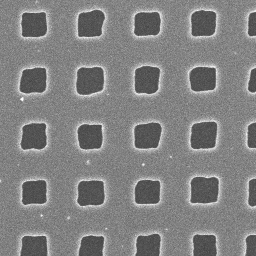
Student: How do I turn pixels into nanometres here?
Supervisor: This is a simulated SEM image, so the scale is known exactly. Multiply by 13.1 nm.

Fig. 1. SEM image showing a regular array of holes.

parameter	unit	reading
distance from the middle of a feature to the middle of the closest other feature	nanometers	729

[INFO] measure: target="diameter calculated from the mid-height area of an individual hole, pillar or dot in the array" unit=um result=0.366